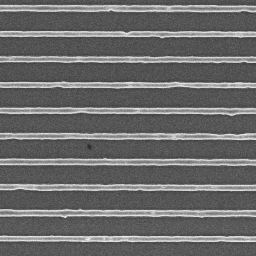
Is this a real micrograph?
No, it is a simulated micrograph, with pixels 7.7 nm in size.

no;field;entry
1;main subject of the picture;parallel lines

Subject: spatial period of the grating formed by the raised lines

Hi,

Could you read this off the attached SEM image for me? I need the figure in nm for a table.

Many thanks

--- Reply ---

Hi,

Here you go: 197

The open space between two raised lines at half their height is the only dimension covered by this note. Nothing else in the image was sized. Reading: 0.152 um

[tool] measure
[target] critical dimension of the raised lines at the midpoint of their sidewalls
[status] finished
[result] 5.88 px